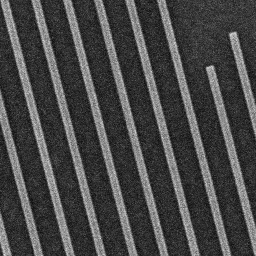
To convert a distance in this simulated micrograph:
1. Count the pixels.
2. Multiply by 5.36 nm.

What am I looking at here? parallel lines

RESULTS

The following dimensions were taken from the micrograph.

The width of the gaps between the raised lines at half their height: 0.124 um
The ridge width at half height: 37.6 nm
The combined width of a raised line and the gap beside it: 163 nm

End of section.